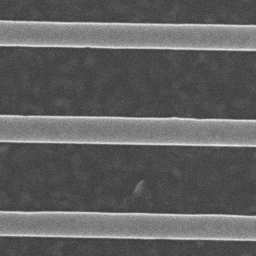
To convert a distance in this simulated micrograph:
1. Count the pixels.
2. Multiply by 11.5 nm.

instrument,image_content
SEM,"one or a few lines or trenches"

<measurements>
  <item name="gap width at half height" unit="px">69.5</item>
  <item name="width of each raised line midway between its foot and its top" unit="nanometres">280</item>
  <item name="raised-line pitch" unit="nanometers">1090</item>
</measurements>